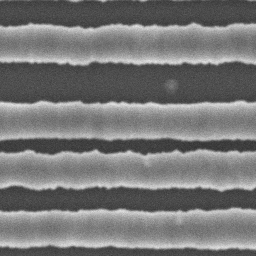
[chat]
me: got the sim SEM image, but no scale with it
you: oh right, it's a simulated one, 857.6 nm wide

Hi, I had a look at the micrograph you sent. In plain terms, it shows lines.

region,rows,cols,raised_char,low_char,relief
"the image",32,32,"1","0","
00000000000000000000000000000000
00000000000000000000000000000000
00000000000000000000000000000000
11111111110011111111111111111111
11111111111111111111111111111111
11111111111111111111111111111111
11111111111111111111111111111111
11111111111111111111111111111111
00000000000000000000000000000000
00000000000000000000000000000000
00000000000000000000000000000000
00000000000000000000000000000000
00000000000000000000000000000000
11111111111111111111111111111111
11111111111111111111111111111111
11111111111111111111111111111111
11111111111111111111111111111111
00000000000000000000000111000000
00000000000000000000000000000000
11111111111111111111111111111111
11111111111111111111111111111111
11111111111111111111111111111111
11111111111111111111111111111111
00011110111000000011100101111111
00000000000000000000000000000000
00000000000000000000000000000000
10110111111111111101101111111111
11111111111111111111111111111111
11111111111111111111111111111111
11111111111111111111111111111111
11111111111111111111111111111111
00000000000000000000000000000000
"